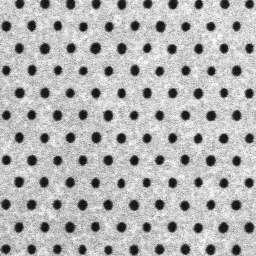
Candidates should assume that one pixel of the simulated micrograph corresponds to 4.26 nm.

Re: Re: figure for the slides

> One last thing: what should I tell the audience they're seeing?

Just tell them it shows a regular array of holes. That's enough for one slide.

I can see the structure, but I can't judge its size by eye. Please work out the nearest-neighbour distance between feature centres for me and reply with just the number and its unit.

108 nm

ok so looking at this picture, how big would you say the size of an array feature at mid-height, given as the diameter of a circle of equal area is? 43.1 nm